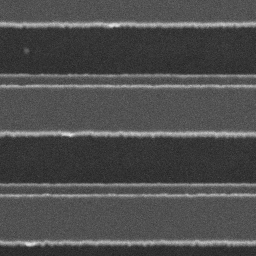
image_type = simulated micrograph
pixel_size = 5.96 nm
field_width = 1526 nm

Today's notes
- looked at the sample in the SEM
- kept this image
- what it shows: lines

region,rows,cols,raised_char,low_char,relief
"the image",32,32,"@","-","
@@@@@@@@@@@@@@@@@@@@@@@@@@@@@@@@
@@@@@@@@@@@@@@@@@@@@@@@@@@@@@@@@
@@@@@@@@@@@@@@@@@@@@@@@@@@@@@@@@
--------------------------------
--------------------------------
--------------------------------
--------------------------------
--------------------------------
--------------------------------
@@@@@@@@@@@@@@@@@@@@@@@@@@@@@@@@
@@@@@@@@@@@@@@@@@@@@@@@@@@@@@@@@
@@@@@@@@@@@@@@@@@@@@@@@@@@@@@@@@
@@@@@@@@@@@@@@@@@@@@@@@@@@@@@@@@
@@@@@@@@@@@@@@@@@@@@@@@@@@@@@@@@
@@@@@@@@@@@@@@@@@@@@@@@@@@@@@@@@
@@@@@@@@@@@@@@@@@@@@@@@@@@@@@@@@
@@@@@@@@@@@@@@@@@@@@@@@@@@@@@@@@
--------------------------------
--------------------------------
--------------------------------
--------------------------------
--------------------------------
--------------------------------
@@@@@@@@@@@@@@@@@@@@@@@@@@@@@@@@
@@@@@@@@@@@@@@@@@@@@@@@@@@@@@@@@
@@@@@@@@@@@@@@@@@@@@@@@@@@@@@@@@
@@@@@@@@@@@@@@@@@@@@@@@@@@@@@@@@
@@@@@@@@@@@@@@@@@@@@@@@@@@@@@@@@
@@@@@@@@@@@@@@@@@@@@@@@@@@@@@@@@
@@@@@@@@@@@@@@@@@@@@@@@@@@@@@@@@
---@@---------------------------
--------------------------------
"